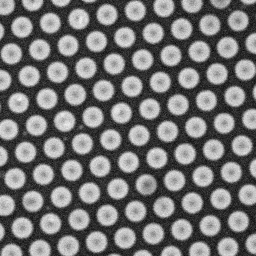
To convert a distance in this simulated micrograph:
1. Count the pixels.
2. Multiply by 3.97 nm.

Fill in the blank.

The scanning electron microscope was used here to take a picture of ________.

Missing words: an array of small figures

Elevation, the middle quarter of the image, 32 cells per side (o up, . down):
...ooooo..ooooo...oooo..........
o..ooooo..ooooo...............oo
o..ooooo....o..........oo....ooo
.....o..........oo....oooo...ooo
.........oo....oooo...ooooo..ooo
.ooo....oooo..ooooo...oooo....oo
ooooo..ooooo...oooo...oooo......
ooooo..ooooo...oooo.............
ooooo...oooo...............ooo..
.oooo...............ooo...ooooo.
.............ooo...ooooo..ooooo.
.....oooo...ooooo..ooooo..ooooo.
oo...ooooo..ooooo..ooooo...ooo..
ooo..ooooo..ooooo...ooo.........
ooo..oooo....ooo.........oo....o
oo....oo..........oo....oooo..oo
oo.........oo....oooo..ooooo...o
....o.....oooo..ooooo..ooooo...o
..ooooo..ooooo..ooooo...oooo....
..ooooo..ooooo...oooo...........
..ooooo...oooo...............ooo
...oooo...............ooo...oooo
...............oo....ooooo..oooo
........oo....oooo...ooooo..oooo
.oo....oooo...ooooo..ooooo...ooo
oooo...oooo...oooo....ooo.......
oooo...oooo....ooo..............
oooo...oooo...............oooo..
oooo...............ooo...ooooo..
............ooo...ooooo..ooooo..
.....ooo...ooooo..ooooo..ooooo..
o...ooooo..ooooo..ooooo....oo...